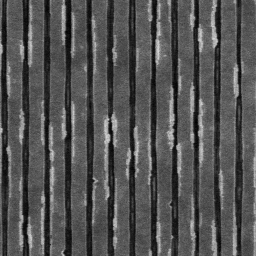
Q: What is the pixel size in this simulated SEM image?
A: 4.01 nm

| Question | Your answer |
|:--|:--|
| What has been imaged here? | parallel lines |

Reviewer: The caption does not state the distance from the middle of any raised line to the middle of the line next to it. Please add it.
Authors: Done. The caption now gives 21.3 pixels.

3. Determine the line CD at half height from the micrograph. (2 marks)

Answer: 60.6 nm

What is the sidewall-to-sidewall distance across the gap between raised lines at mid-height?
26.1 nm